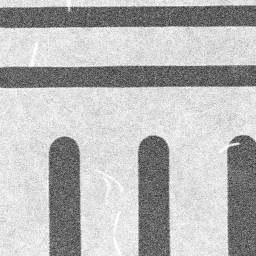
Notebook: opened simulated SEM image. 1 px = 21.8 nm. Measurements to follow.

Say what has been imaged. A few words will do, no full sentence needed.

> groups of lines, slits or small figures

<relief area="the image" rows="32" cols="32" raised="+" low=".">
++++++++++++++++++++++++++++++++
................................
................................
...................+++++++++++++
++++++++++++++++++++++++++++++++
++++++++++++++++++++++++++++++++
++++++++++++++++++++++++++++++++
++++++++++++++++++++++++++++++++
................................
................................
................................
++++++++++++++++++++++++++++++++
++++++++++++++++++++++++++++++++
++++++++++++++++++++++++++++++++
++++++++++++++++++++++++++++++++
++++++++++++++++++++++++++++++++
++++++++++++++++++++++++++++++++
+++++++..+++++++++...++++++++...
++++++....+++++++....++++++++...
++++++....+++++++....+++++++....
++++++....+++++++....+++++++....
++++++....+++++++....+++++++....
++++++....+++++++....+++++++....
++++++....+++++++....+++++++....
++++++....+++++++....+++++++....
++++++....+++++++....+++++++....
++++++....+++++++....+++++++....
++++++....+++++++....+++++++....
++++++....+++++++....+++++++....
++++++....+++++++....+++++++....
++++++....+++++++....+++++++....
++++++....+++++++....+++++++....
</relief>